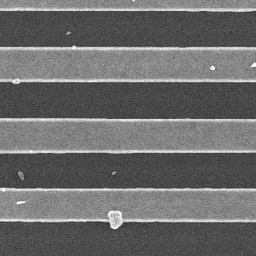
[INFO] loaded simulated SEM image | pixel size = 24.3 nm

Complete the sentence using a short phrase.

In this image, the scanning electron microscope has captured lines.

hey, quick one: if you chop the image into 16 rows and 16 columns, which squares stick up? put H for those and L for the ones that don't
HHHHHHHHHHHHHHHH
LLLLLLLLLLLLLLLL
LLLLLLLLLLLLLLLL
HHHHHHHHHHHHHHHH
HHHHHHHHHHHHHHHH
LLLLLLLLLLLLLLLL
LLLLLLLLLLLLLLLL
HHHHHHHHHHHHHHHH
HHHHHHHHHHHHHHHH
HHHHHHHHHHHHHHHH
LLLLLLLLLLLLLLLL
LLLLLLLLLLLLLLLL
HHHHHHHHHHHHHHHH
HHHHHHHHHHHHHHHH
LLLLLLLLLLLLLLLL
LLLLLLLLLLLLLLLL